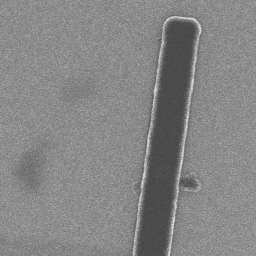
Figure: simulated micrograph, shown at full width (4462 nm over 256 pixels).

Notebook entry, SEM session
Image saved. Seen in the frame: one or a few lines or trenches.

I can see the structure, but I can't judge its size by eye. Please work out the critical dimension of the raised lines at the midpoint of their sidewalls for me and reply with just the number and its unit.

36.3 pixels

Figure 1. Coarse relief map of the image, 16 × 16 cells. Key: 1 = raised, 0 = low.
0000000000000000
0000000000110000
0000000000110000
0000000000110000
0000000000110000
0000000000110000
0000000000110000
0000000001110000
0000000001110000
0000000001100000
0000000001100000
0000000001100000
0000000001100000
0000000001100000
0000000011100000
0000000011100000